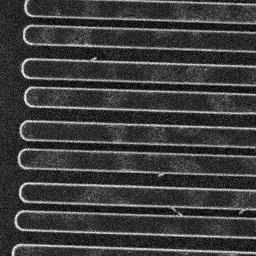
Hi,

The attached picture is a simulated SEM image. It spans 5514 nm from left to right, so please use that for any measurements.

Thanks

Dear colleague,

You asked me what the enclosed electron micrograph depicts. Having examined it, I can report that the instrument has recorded parallel lines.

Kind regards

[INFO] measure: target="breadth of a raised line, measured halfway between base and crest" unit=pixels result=18.9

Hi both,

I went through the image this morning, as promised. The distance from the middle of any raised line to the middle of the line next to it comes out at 30.8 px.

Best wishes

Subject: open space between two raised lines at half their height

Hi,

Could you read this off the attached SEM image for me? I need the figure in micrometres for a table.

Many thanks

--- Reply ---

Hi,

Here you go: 0.285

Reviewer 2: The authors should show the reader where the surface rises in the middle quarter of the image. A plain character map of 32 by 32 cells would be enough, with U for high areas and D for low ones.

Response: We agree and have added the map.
UUUUUUUUUUUUUUUUUUUUUUUUUUUUUUUU
UUUUUUUUUUUUUUUUUUUUUUUUUUUUUUUU
UUUUUUUUUUUUUUUUUUUUUUUUUUUUUUUU
UUUUUUUUUUUUUUUUUUUUUUUUUUUUUUUU
DDDDDDDDDDDDDDDDDDDDDUUUUUUUUUUU
DDDDDDDDDDDDDDDDDDDDDDDDDDDDDDDD
UUUUUUUUUUDDDDDDDDDDDDDDDDDDDDDD
UUUUUUUUUUUUUUUUUUUUUUUUUUUUUUUU
UUUUUUUUUUUUUUUUUUUUUUUUUUUUUUUU
UUUUUUUUUUUUUUUUUUUUUUUUUUUUUUUU
UUUUUUUUUUUUUUUUUUUUUUUUUUUUUUUU
DDDDDDDDDDDDDDDDDDDUUUUUUUUUUUUU
DDDDDDDDDDDDDDDDDDDDDDDDDDDDDDDD
DDDDDDDDDDDDDDDDDDDDDDDDDDDDDDDD
DDDDDDDDDDDDDDDDDDDDDDDDDDDDDDDD
UUUUUUUUUUUUUUUUUUUUUUUDDDDDDDDD
UUUUUUUUUUUUUUUUUUUUUUUUUUUUUUUU
UUUUUUUUUUUUUUUUUUUUUUUUUUUUUUUU
UUUUUUUUUUUUUUUUUUUUUUUUUUUUUUUU
DDDDDDDDUUUUUUUUUUUUUUUUUUUUUUUU
DDDDDDDDDDDDDDDDDDDDDDDDDDDDDDDD
DDDDDDDDDDDDDDDDDDDDDDDDDDDDDDDD
UUUUUUUUUUUUUUUUUUUUUUUUUUUDDDDD
UUUUUUUUUUUUUUUUUUUUUUUUUUUUUUUU
UUUUUUUUUUUUUUUUUUUUUUUUUUUUUUUU
UUUUUUUUUUUUUUUUUUUUUUUUUUUUUUUU
DDDDDDUUUUUUUUUUUUUUUUUUUUUUUUUU
DDDDDDDDDDDDDDDDDDDDDDDDUDDDDDDD
DDDDDDDDDDDDDDDDDDDDDDDDDDDDDDDD
DDDDDDDDDDDDDDDDDDDDDDDDDDDDDDDD
UUUUUUUUUUDDDDDDDDDDDDDDDDDDDDDD
UUUUUUUUUUUUUUUUUUUUUUUUUUUUUUUU